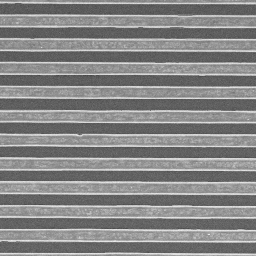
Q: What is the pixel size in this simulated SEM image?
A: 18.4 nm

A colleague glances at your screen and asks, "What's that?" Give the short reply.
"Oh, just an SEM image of parallel lines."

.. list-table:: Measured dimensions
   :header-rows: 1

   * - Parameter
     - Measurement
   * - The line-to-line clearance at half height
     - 237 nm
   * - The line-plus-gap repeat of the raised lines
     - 438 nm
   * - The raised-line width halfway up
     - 200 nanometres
